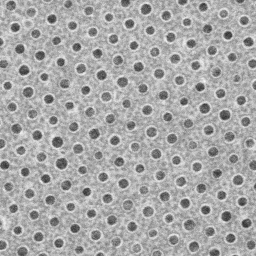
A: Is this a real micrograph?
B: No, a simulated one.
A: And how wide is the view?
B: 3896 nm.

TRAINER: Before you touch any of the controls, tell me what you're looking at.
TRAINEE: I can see a regular array of holes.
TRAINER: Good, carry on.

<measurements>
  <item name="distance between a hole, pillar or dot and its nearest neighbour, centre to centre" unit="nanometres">327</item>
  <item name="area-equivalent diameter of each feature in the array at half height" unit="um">0.158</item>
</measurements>